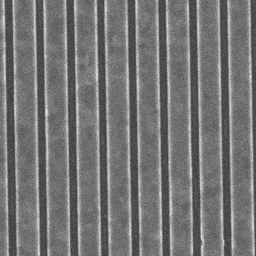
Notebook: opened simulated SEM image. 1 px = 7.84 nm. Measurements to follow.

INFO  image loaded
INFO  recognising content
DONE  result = parallel lines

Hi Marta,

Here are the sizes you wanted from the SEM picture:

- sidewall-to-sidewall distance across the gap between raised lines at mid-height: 68.6 nanometres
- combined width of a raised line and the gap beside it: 30.7 pixels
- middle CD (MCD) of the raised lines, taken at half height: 174 nm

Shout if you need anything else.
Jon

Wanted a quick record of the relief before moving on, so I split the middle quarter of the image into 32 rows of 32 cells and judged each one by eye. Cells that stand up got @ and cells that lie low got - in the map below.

@--@@@@@---@@@@@--@@@@@@--@@@@@-
@--@@@@@---@@@@@--@@@@@@--@@@@@-
@--@@@@@---@@@@@--@@@@@@--@@@@@-
@--@@@@@---@@@@@--@@@@@@--@@@@@-
@--@@@@@---@@@@@--@@@@@@--@@@@@-
@--@@@@@---@@@@@--@@@@@@--@@@@@-
@--@@@@@---@@@@@--@@@@@@--@@@@@-
@--@@@@@---@@@@@--@@@@@@--@@@@@-
@--@@@@@---@@@@@--@@@@@@--@@@@@-
@--@@@@@---@@@@@--@@@@@@--@@@@@-
@--@@@@@@--@@@@@--@@@@@@--@@@@@-
@--@@@@@@--@@@@@--@@@@@@--@@@@@-
@--@@@@@@--@@@@@--@@@@@@--@@@@@-
@--@@@@@@--@@@@@--@@@@@@--@@@@@@
@--@@@@@@--@@@@@--@@@@@@--@@@@@@
@--@@@@@@--@@@@@--@@@@@@--@@@@@@
@--@@@@@@--@@@@@---@@@@@--@@@@@@
@--@@@@@@--@@@@@---@@@@@--@@@@@@
@--@@@@@@--@@@@@---@@@@@--@@@@@@
@--@@@@@@--@@@@@---@@@@@--@@@@@@
@--@@@@@@--@@@@@---@@@@@--@@@@@@
@--@@@@@@--@@@@@---@@@@@--@@@@@@
@--@@@@@@--@@@@@---@@@@@--@@@@@@
@--@@@@@@--@@@@@---@@@@@--@@@@@@
@--@@@@@@--@@@@@---@@@@@--@@@@@@
@--@@@@@@--@@@@@---@@@@@--@@@@@@
@--@@@@@@--@@@@@---@@@@@--@@@@@@
@--@@@@@@--@@@@@---@@@@@--@@@@@@
@--@@@@@@--@@@@@---@@@@@--@@@@@@
@---@@@@@--@@@@@---@@@@@--@@@@@@
@---@@@@@--@@@@@---@@@@@--@@@@@@
@---@@@@@--@@@@@---@@@@@--@@@@@@